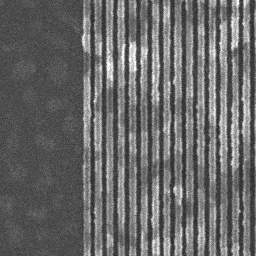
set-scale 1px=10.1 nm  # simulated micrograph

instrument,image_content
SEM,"parallel lines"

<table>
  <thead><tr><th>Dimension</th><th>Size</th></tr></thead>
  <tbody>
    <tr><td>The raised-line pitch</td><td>0.115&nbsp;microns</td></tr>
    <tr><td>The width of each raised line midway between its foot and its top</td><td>60.7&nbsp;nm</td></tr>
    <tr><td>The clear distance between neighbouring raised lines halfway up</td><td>53.1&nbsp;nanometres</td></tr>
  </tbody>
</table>